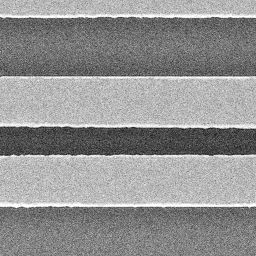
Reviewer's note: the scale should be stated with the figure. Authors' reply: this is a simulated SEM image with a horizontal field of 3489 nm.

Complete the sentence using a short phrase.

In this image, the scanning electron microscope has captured lines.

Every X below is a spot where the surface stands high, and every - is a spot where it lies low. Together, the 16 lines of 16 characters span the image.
XXXXXXXXXXXXXXXX
----------------
----------------
----------------
----------------
XXXXXXXXXXXXXXXX
XXXXXXXXXXXXXXXX
XXXXXXXXXXXXXXXX
----------------
----------------
XXXXXXXXXXXXXXXX
XXXXXXXXXXXXXXXX
XXXXXXXXXXXXXXXX
----------------
----------------
----------------